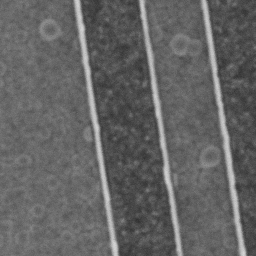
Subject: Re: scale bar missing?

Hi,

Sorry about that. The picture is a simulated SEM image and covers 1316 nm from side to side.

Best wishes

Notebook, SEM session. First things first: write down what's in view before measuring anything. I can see one or a few lines or trenches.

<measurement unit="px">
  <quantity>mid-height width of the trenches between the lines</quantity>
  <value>60.6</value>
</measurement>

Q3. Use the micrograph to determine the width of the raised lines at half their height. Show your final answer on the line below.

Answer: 334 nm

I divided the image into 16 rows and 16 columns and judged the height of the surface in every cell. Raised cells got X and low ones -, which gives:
-----XXXX----XXX
-----XXXX----XXX
-----XXXX----XXX
-----XXXX----XXX
-----XXXXX---XXX
------XXXX----XX
------XXXX----XX
------XXXX----XX
------XXXX----XX
------XXXX----XX
------XXXX----XX
-------XXXX---XX
-------XXXX----X
-------XXXX----X
-------XXXX----X
-------XXXX----X